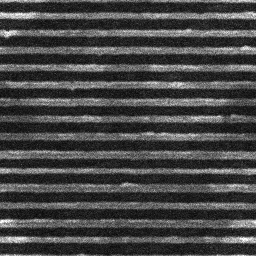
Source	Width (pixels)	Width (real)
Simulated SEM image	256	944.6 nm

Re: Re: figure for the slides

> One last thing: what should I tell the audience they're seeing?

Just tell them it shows parallel lines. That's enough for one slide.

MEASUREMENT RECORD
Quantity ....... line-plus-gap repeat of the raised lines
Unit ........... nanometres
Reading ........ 63.6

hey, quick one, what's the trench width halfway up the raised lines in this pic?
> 11.4 px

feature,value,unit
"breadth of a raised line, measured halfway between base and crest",6.12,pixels